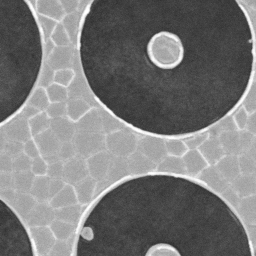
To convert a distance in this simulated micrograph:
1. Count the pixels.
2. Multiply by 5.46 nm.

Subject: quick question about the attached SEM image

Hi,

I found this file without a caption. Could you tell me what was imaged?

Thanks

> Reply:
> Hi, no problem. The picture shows ring-shaped grooves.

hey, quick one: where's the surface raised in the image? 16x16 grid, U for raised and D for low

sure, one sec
DDUUUUDDDDDDDDDU
DDUUUDDDDDDDDDDD
DDDUUDDDDUUDDDDD
DDDUUDDDDUUDDDDD
DDDUUDDDDDDDDDDD
DDUUUUDDDDDDDDDU
DUUUUUDDDDDDDDDU
UUUUUUUUDDDDDDUU
UUUUUUUUUUUUUUUU
UUUUUUUUUUUUUUUU
UUUUUUUUUUUUUUUU
UUUUUUUDDDDDUUUU
UUUUUUDDDDDDDDUU
DUUUUDDDDDDDDDDU
DDUUUDDDDDDDDDDU
DDUUUDDDDDUDDDDD